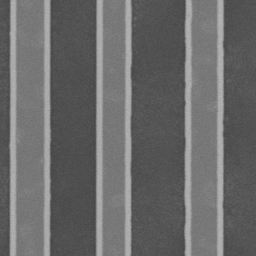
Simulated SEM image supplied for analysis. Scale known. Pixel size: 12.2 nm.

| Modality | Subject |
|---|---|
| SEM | one or a few lines or trenches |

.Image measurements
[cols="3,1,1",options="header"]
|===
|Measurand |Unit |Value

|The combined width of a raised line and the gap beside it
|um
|1.07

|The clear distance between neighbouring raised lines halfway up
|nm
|679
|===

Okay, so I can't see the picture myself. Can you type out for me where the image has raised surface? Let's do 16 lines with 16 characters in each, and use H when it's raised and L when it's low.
LHHLLLHHLLLLHHLL
LHHLLLHHLLLLHHLL
LHHLLLHHLLLLHHLL
LHHLLLHHLLLLHHLL
LHHLLLHHLLLLHHLL
LHHLLLHHLLLLHHLL
LHHLLLHHLLLLHHLL
LHHLLLHHLLLLHHLL
LHHLLLHHLLLLHHLL
LHHLLLHHLLLLHHLL
LHHLLLHHLLLLHHLL
LHHLLLHHLLLLHHLL
LHHLLLHHLLLLHHLL
LHHLLLHHLLLLHHLL
LHHLLLHHLLLLHHLL
LHHLLLHHLLLLHHLL